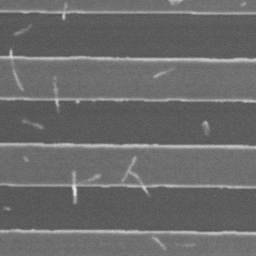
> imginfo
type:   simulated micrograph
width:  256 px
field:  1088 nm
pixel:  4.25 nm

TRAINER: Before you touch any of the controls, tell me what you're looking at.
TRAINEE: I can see lines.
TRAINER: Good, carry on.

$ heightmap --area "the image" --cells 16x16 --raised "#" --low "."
################
................
................
#...............
################
################
................
................
................
################
################
################
................
................
############....
################